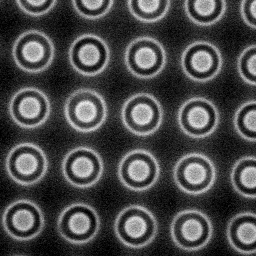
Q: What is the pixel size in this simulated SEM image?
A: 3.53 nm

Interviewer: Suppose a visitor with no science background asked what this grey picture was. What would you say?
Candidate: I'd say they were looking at an array of small figures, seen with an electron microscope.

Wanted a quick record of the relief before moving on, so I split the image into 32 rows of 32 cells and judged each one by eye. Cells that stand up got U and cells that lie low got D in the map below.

UUUDDDDUUDDDDDUUDDDDDUUDDDDDUUDD
UUUUDUUUUUDDDUUUUDDDDUUUDDDDUUDD
UUUUUUUUUUUUUUUUUUUUUUUUDDDUUUUD
UUUUUUUUUUUUUUUUUUUUUUUUUUUUUUUU
UUUDDUUUUUUUUUUUUUUUUUUUUUUUUUUU
UUDDDDUUUDDDDUUUUDDDUUUUUDUUUUUU
UUDDDDUUUDDDDUUUDDDDUUUDDDDUUUUD
UUDDDDUUUDDDDUUUDDDDUUUDDDDUUUDD
UUUDDUUUUUDDDUUUDDDDUUUDDDDUUUDD
UUUUUUUUUUUUUUUUUUUUUUUUDDUUUUDD
UUUUUUUUUUUUUUUUUUUUUUUUUUUUUUUU
UUUDDUUUUUDUUUUUUUUUUUUUUUUUUUUU
UUDDDDUUUDDDDUUUDDDUUUUUUUUUUUUU
UDDDDDUUDDDDDUUUDDDDUUUDDDDUUUDD
UUDDDDUUDDDDDUUUDDDDUUUDDDDUUUDD
UUUDDUUUUDDDUUUUDDDDUUUDDDDUUUDD
UUUUUUUUUUUUUUUUUDDUUUUDDDUUUUDD
UUUUUUUUUUUUUUUUUUUUUUUUUUUUUUUU
UUDDUUUUUUUUUUUUUUUUUUUUUUUUUUUU
UDDDDUUUUDDDUUUUDDDUUUUUDUUUUUUU
UDDDDDUUDDDDDUUDDDDUUUDDDDUUUUDD
UDDDDUUUDDDDUUUDDDDDUUDDDDDUUDDD
UUDDDUUUUDDDUUUDDDDUUUDDDDUUUDDD
UUUUUUUUUUUUUUUUUDUUUUUDDDUUUUDD
UUUUUUUUUUUUUUUUUUUUUUUUUUUUUUUU
UUDDUUUUUUUUUUUUUUUUUUUUUUUUUUUU
UDDDDUUUDDDDUUUDDDUUUUUUUUUUUUUU
UDDDDUUUDDDDUUUDDDDUUUDDDDUUUDDD
UDDDDUUDDDDDUUUDDDDUUUDDDDUUUDDD
UUDDUUUUDDDUUUUDDDDUUUDDDDUUUDDD
UUUUUUUUUUUUUUUUDDUUUUDDDUUUUDDD
UUUUUUUUUUUUUUUUUUUUUUUUUUUUUUUU